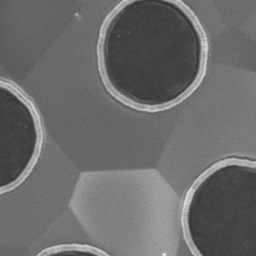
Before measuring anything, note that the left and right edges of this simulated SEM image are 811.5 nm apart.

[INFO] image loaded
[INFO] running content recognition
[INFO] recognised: holes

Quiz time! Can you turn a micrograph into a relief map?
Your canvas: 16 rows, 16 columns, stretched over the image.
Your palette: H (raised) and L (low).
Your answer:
HHHHHHHHLLLHHHHH
HHHHHHHLLLLLHHHH
HHHHHHHLLLLLHHHH
HHHHHHHLLLLLLHHH
HHHHHHHLLLLLHHHH
HHHHHHHLLLLLHHHH
LHHHHHHHHLHHHHHH
LLHHHHHHHHHHHHHH
LLHHHHHHHHHHHHHH
LLHHHHHHHHHHHHHH
LLHHHHHHHHHHHHLL
HHHHHHHHHHHHHLLL
HHHHHHHHHHHHLLLL
HHHHHHHHHHHHLLLL
HHHHHHHHHHHHLLLL
HHHHHHHHHHHHLLLL